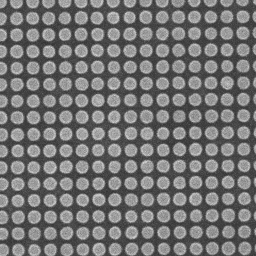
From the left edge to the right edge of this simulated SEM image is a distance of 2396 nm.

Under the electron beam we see a regular array of raised bodies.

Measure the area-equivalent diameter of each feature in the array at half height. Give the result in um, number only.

0.114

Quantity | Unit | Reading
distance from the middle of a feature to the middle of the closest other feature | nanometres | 150